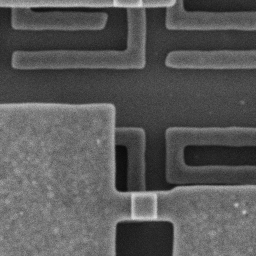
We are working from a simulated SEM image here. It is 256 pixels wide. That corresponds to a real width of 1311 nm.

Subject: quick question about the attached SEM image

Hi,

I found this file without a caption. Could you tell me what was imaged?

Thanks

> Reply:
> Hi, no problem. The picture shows wiring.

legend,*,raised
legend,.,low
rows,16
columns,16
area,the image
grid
................
................
................
................
................
................
.**.............
*******.........
*******.........
*******.........
*******.........
*******.........
****************
****************
*******....*****
*******....*****